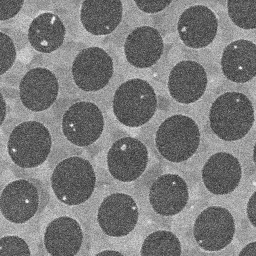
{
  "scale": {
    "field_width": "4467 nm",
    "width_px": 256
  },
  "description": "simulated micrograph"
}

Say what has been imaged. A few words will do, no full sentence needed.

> a regular array of holes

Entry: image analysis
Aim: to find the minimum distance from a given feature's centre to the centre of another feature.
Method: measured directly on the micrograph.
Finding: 966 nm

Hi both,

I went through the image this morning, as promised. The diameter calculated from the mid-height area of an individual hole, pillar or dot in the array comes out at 0.76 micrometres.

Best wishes